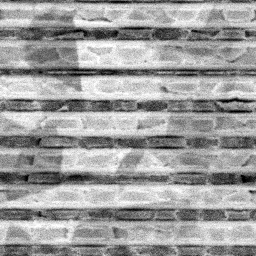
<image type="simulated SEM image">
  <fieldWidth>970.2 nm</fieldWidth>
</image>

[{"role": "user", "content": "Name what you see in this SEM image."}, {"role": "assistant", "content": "parallel lines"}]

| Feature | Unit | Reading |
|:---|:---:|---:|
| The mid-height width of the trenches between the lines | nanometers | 58.7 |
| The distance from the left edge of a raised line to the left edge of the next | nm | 138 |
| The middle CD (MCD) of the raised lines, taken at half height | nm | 79.6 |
